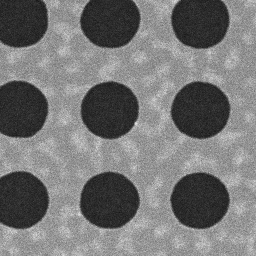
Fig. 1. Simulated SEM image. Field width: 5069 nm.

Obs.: holes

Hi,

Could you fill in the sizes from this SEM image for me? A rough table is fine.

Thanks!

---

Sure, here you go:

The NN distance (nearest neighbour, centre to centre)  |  90.3 px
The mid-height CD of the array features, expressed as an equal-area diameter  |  1.16 µm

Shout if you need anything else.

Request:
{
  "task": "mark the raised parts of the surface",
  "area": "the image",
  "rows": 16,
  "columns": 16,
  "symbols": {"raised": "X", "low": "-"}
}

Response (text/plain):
---XX----XX---XX
---XX----XX---XX
--XXXX--XXX---XX
XXXXXXXXXXXXXXXX
XXXXXXXXXXXXXXXX
--XXXX--XXX---XX
---XX----XX---XX
---XX----XX---XX
--XXXX--XXXX-XXX
XXXXXXXXXXXXXXXX
XXXXXXXXXXXXXXXX
---XX---XXX---XX
---XX----XX---XX
---XX---XXX---XX
XXXXXXXXXXXXXXXX
XXXXXXXXXXXXXXXX